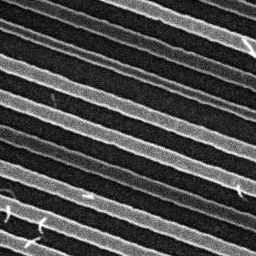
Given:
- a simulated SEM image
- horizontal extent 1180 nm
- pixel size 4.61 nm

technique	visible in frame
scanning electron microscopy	parallel lines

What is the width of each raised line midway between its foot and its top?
0.0667 micrometres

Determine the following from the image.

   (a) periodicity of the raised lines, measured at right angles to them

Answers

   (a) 0.153 µm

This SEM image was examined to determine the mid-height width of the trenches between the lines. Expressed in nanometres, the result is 86.8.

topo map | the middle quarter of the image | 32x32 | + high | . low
.........+++++++...............+
.............++++++.............
...............+++++++..........
..................++++++........
++..................+++++++.....
++++++..................++++++..
+++++++++.................++++++
.+++++++++++.................+++
.....+++++++++.................+
.......++++++++++...............
..........++++++++++............
............++++++++++..........
+..............++++++++++.......
++++..............++++++++++....
+++++++.............+++++++++++.
+++++++++...............++++++++
..++++++++++..............++++++
....+++++++++++..............+++
.......+++++++++++..............
..........+++++++++++...........
.............++++++++++.........
+..............+++++++++++......
++++..............+++++++++++...
+++++++..............++++++++++.
++++++++++..............++++++++
..+++++++++++..............+++++
.....+++++++++++.............+++
........++++++++++..............
..........+++++++++++...........
.............+++++++++++........
++..............++++++++++......
+++++..............++++++++++...